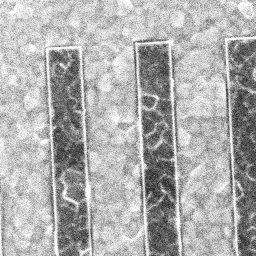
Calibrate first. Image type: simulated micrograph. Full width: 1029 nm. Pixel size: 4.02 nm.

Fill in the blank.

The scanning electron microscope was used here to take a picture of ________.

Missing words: one or a few lines or trenches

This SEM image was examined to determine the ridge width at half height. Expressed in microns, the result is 0.139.